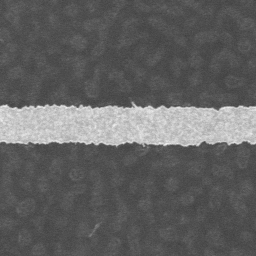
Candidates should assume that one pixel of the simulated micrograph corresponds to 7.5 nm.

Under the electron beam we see one or a few lines or trenches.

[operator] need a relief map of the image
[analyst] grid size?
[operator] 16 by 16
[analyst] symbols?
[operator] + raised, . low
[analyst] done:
................
................
................
................
................
................
................
++++++++++++++++
++++++++++++++++
................
................
................
................
................
................
................